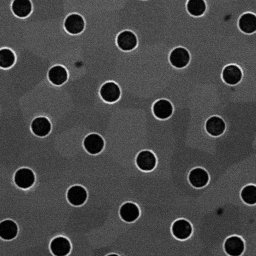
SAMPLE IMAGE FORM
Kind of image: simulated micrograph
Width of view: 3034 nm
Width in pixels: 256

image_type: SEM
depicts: a regular array of holes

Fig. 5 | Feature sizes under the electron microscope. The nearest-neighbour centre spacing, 641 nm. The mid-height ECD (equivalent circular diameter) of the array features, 242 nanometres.